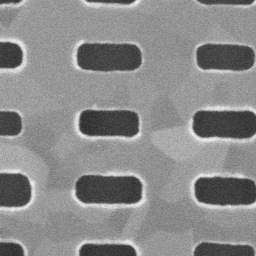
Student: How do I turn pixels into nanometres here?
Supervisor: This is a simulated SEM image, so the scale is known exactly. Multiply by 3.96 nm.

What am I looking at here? holes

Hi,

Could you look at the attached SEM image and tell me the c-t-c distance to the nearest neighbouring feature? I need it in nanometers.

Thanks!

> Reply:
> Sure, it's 262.